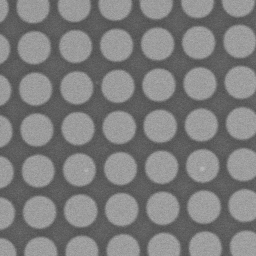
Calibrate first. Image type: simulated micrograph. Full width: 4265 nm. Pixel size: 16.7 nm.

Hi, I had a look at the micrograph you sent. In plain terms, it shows an array of small figures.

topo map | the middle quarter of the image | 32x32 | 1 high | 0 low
00000000000000000000000000000000
00000000000000000000001110000000
01111000000111110000011111100001
11111100001111111000111111100011
11111110001111111000111111110011
11111110001111111000111111110011
11111110001111111000111111110011
11111110001111111000111111100001
11111100000111110000011111000000
01111000000000000000000000000000
00000000000000000000000000000000
00000000000000000000000000000000
00111000000011110000011111100001
11111100000111111000111111110001
11111110001111111100111111110011
11111110001111111100111111110011
11111110001111111100111111110011
11111110001111111000011111110001
11111110000111111000011111100000
01111100000011100000000110000000
00000000000000000000000000000000
00000000000000000000000000000000
00000000000011110000001111100000
01111100000111111000011111110001
11111110001111111100011111110001
11111111001111111100111111110001
11111111001111111100111111110001
11111111001111111100011111110001
11111110000111111000011111100000
01111100000011110000000111000000
00000000000000000000000000000000
00000000000000000000000000000000